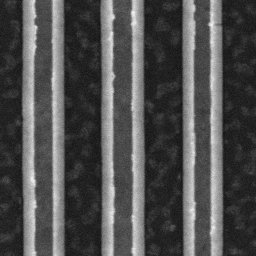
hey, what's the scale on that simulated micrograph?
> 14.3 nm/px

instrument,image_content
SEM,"one or a few lines or trenches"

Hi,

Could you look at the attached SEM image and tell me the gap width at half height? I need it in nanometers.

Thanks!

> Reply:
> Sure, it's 686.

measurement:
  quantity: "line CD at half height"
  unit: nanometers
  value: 454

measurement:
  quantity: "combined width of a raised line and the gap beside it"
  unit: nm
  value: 1140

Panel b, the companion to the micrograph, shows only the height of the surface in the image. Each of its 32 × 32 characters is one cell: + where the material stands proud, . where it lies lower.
....+++......++++......++++.....
....+++......++++......++++.....
....+++......++++......++++.....
...++++......++++......++++.....
...++++......++++......++++.....
...++++......++++......++++.....
...++++......++++......++++.....
...++++......++++......++++.....
...++++......++++......++++.....
...++++......++++......++++.....
...++++......++++......++++.....
...++++......++++......++++.....
...++++......++++......++++.....
...++++......++++......++++.....
...++++......++++......++++.....
....+++......++++......++++.....
....+++......++++......++++.....
....+++......++++......++++.....
....+++......++++......++++.....
....+++......++++......++++.....
....+++......++++......++++.....
....+++......++++......++++.....
....+++.......+++......++++.....
....+++......++++......++++.....
....+++......++++......++++.....
....+++......++++.......+++.....
....+++......++++.......+++.....
....+++......++++.......+++.....
....+++......++++.......+++.....
....+++......++++.......+++.....
....+++......++++.......+++.....
....+++......++++.......+++.....